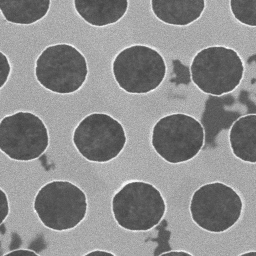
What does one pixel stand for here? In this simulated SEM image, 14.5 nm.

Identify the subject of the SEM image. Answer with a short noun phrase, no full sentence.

a regular array of holes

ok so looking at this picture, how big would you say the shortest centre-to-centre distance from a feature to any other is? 1.12 um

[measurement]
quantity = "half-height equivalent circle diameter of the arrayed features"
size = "50.7 pixels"